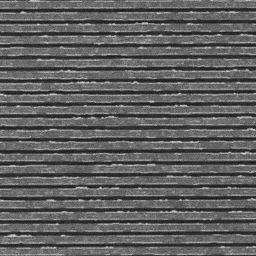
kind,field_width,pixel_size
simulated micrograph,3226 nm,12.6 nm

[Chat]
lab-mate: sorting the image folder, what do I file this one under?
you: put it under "parallel lines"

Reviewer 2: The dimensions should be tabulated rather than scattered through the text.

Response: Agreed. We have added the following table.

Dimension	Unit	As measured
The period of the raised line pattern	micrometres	0.148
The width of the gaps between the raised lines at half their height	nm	52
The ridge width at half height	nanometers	96.1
